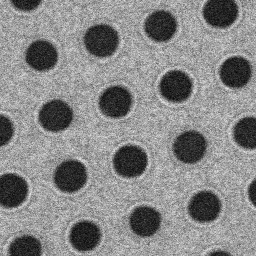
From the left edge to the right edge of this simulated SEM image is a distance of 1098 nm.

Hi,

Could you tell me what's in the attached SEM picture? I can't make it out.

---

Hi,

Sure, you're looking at a regular array of holes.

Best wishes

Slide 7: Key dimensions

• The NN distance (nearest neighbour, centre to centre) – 264 nanometers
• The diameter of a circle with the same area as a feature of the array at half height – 0.153 um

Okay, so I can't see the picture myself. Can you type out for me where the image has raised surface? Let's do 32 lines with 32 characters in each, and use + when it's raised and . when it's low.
+....++++++++++++++++++++.....++
+++.+++++++++++++++..++++.....++
++++++++++++++++++....+++.....++
+++++++++++...++++....+++++.++++
++++++++++.....+++....++++++++++
++++...+++.....+++++++++++++++++
+++....++++....+++++++++++++++++
+++....+++++++++++++++++++++...+
+++....++++++++++++++++++++.....
++++++++++++++++++++....+++.....
++++++++++++++++++++....++++...+
+++++++++++++...++++....++++++++
++++++..++++.....++++..+++++++++
+++++....+++.....+++++++++++++++
.++++....++++...+++++++++++++++.
..+++....++++++++++++++++++++...
..++++..+++++++++++++++..++++...
..++++++++++++++++++++....+++...
+++++++++++++++...+++.....++++..
++++++++++++++....++++....++++++
+++++++...++++....+++++.++++++++
+++++++....+++....++++++++++++++
...++++....+++++++++++++++++++++
....+++...+++++++++++++++++++++.
....++++++++++++++++++++...++++.
...++++++++++++++++++++.....+++.
++++++++++++++++....+++.....++++
++++++++++.+++++....++++...+++++
+++++++++....+++....++++++++++++
++..++++.....++++..+++++++++++++
+....++++...++++++++++++++++++++
+....+++++.+++++++++++++++...+++